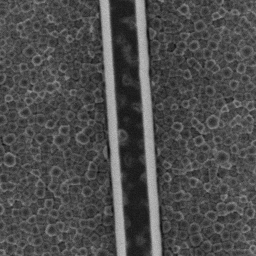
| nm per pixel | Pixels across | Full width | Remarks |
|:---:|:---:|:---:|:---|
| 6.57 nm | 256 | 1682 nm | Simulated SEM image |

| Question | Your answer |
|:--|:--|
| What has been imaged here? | one or a few lines or trenches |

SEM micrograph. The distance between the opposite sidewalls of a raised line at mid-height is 0.228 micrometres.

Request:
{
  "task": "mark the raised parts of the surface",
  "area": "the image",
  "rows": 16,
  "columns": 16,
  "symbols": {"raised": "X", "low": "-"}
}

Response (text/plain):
-------XX-------
-------XX-------
-------XX-------
-------XX-------
-------XX-------
-------XX-------
-------XX-------
-------XX-------
-------XX-------
-------XX-------
-------XX-------
-------XX-------
-------XXX------
-------XXX------
--------XX------
--------XX------